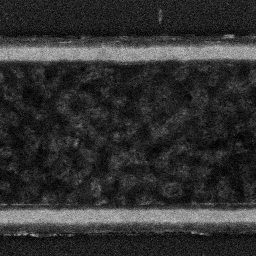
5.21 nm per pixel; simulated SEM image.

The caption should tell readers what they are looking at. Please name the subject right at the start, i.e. one or a few lines or trenches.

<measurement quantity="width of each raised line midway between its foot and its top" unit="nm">849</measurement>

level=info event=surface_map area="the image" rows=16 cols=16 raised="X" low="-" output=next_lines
----------------
----------------
----------------
XXXXXXXXXXXXXXXX
XXXXXXXXXXXXXXXX
XXXXXXXXXXXXXXXX
XXXXXXXXXXXXXXXX
XXXXXXXXXXXXXXXX
XXXXXXXXXXXXXXXX
XXXXXXXXXXXXXXXX
XXXXXXXXXXXXXXXX
XXXXXXXXXXXXXXXX
XXXXXXXXXXXXXXXX
X--XXX--X-X---X-
----------------
----------------